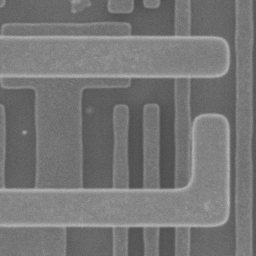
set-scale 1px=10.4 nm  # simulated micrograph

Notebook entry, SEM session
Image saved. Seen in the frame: wiring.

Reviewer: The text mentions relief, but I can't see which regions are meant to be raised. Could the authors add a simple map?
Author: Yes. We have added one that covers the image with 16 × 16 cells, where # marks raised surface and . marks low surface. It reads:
................
................
##############..
##############..
##############..
................
................
............##..
............##..
............##..
............##..
............##..
##############..
##############..
................
................